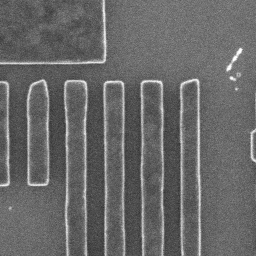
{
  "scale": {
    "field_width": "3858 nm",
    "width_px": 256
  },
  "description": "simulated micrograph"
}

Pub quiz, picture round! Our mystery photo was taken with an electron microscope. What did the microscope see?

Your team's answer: wiring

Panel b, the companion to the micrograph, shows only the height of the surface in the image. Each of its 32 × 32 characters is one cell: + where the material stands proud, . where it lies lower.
+++++++++++++...................
+++++++++++++...................
+++++++++++++...................
+++++++++++++...................
+++++++++++++...................
+++++++++++++...................
+++++++++++++...................
+++++++++++++...................
................................
................................
+...++..+++..++...++...++.......
+...++..+++..++...++...++.......
+..+++..+++..++...++...++.......
+..+++..+++..++...++...++.......
+..+++..+++..++...++...++.......
+...++..+++..++...++...++.......
+...++..+++..++...++...++.......
+...++..+++..++...++...++......+
+...++..+++..++...++...++......+
+...++..+++..++...++...++......+
+...++..+++..++...++...++.......
+...++..+++..++...++...++.......
+...++..+++..++...++...++.......
........+++..++...++...++.......
........+++..++...++...++.......
........+++..++...++...++.......
........+++..++...++...++.......
........+++..++...++...++.......
........+++..+++..++...++.......
........+++..+++..++...++.......
........+++..+++..++...++.......
........+++..+++..++...++.......